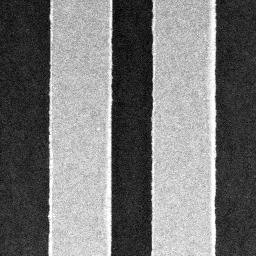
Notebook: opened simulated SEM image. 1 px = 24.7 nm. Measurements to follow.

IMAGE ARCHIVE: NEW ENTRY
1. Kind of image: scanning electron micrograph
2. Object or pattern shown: lines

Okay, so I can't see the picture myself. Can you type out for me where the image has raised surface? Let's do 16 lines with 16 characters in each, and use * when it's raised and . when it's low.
...****...***...
...****...***...
...****...***...
...****...***...
...****...***...
...****...***...
...****...***...
...****...***...
...****...***...
...****...***...
...****...***...
...****...***...
...****...***...
...****...***...
...****...***...
...****...***...